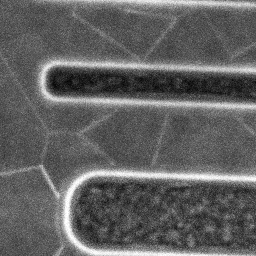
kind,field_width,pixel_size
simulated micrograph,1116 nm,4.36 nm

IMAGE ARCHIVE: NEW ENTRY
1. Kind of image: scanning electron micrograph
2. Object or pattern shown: one or a few lines or trenches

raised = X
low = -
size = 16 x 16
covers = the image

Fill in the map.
XXXXXXXXXXXXXXXX
XXXXXXXXXXXXXXXX
XXXXXXXXXXXXXXXX
XXXXXXXXXXXXXXXX
XXX-------------
XXX-------------
XXXXXXXXXXXXX---
XXXXXXXXXXXXXXXX
XXXXXXXXXXXXXXXX
XXXXXXXXXXXXXXXX
XXXXXXXXXXXXXXXX
XXXXX-----------
XXXX------------
XXXX------------
XXXX------------
XXXXX-----------